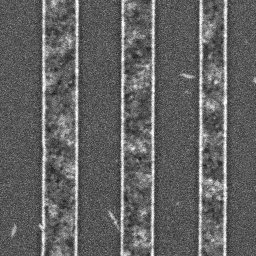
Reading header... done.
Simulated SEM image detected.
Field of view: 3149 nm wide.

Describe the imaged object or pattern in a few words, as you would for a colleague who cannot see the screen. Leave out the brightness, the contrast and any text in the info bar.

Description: one or a few lines or trenches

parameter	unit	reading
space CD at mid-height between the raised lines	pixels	46.9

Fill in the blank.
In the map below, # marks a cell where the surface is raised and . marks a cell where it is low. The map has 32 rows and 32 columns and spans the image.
......####.....####......###....
......####.....####......###....
......####.....####......###....
......####.....####......###....
......####.....####......###....
......####.....####......###....
......####.....####......###....
......####.....####......###....
......####.....####......###....
.....#####.....####......###....
.....#####.....####......###....
.....####......####......###....
.....####......####......###....
.....####......####......###....
.....#####.....####......###....
.....#####.....####......###....
.....#####.....####......###....
.....#####.....####......###....
......####.....####......###....
......####.....####......###....
.....#####.....####......###....
.....#####.....####......###....
.....#####.....####......###....
.....#####.....####......###....
.....#####.....####......###....
.....#####.....####......###....
.....#####.....####......###....
.....#####.....####......###....
.....####......####......###....
.....####......####......###....
.....####......####......###....
.....####......####......###....